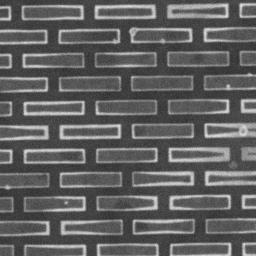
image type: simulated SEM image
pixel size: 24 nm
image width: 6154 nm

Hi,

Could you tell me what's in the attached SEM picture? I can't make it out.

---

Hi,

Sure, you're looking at groups of lines, slits or small figures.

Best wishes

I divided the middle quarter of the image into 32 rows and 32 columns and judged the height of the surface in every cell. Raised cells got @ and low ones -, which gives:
@@@@@---@@@@@-------------------
--------------------------------
--------------------------------
@@@@@@@@@@@@@@---@@@@@@@@@@@@@@@
@@@@@@@@@@@@@@---@@@@@@@@@@@@@@@
@@@@@@@@@@@@@@---@@@@@@@@@@@@@@@
@@@@@@@@@@@@@@---@@@@@----------
--------------------------------
--------------------------------
----------@@@@@@@@@@@@@---@@@@@@
@@@@@---@@@@@@@@@@@@@@@---@@@@@@
@@@@@---@@@@@@@@@@@@@@@---@@@@@@
--------------------------------
--------------------------------
--------------------------------
-----------@@@---@@@@@@@@@@@@@@@
@@@@@@@@@@@@@@---@@@@@@@@@@@@@@@
@@@@@@@@@@@@@@---@@@@@@@@@@@@@@@
--------------------------------
--------------------------------
--------------------------------
---------@@@@@@@@@@@@@@----@@@@@
@@@@@---@@@@@@@@@@@@@@@----@@@@@
@@@@@---@@@@@@@@@@@@@@@----@@@@@
@@@@@---@@@@@@@@@@--------------
--------------------------------
--------------------------------
@@@@@@@@@@@@@@---@@@@@@@@@@@@@@@
@@@@@@@@@@@@@@---@@@@@@@@@@@@@@@
@@@@@@@@@@@@@@---@@@@@@@@@@@@@@@
@@------------------------------
--------------------------------